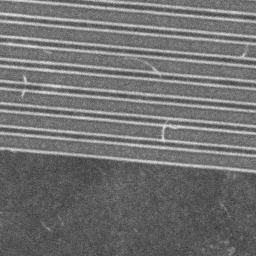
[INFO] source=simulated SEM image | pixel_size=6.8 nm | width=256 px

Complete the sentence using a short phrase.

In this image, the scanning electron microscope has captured parallel lines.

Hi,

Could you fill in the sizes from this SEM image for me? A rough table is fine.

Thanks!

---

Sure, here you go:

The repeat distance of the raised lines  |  152 nm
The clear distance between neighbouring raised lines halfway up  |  98.2 nanometres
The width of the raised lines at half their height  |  52.5 nm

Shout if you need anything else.